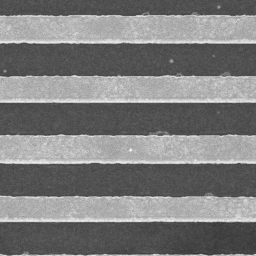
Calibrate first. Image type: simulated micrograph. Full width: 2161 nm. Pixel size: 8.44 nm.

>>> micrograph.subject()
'lines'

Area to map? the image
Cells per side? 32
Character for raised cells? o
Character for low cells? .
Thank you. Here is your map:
................................
................................
oooooooooooooooooooooooooooooooo
oooooooooooooooooooooooooooooooo
oooooooooooooooooooooooooooooooo
................................
................................
................................
................................
...o...o.o..........oo..o.......
oooooooooooooooooooooooooooooooo
oooooooooooooooooooooooooooooooo
oooooooooooooooooooooooooooooooo
................................
................................
................................
................................
oooooooooooooooooooooooooooooooo
oooooooooooooooooooooooooooooooo
oooooooooooooooooooooooooooooooo
................................
................................
................................
................................
................................
oooooooooooooooooooooooooooooooo
oooooooooooooooooooooooooooooooo
oooooooooooooooooooooooooooooooo
................................
................................
................................
................................